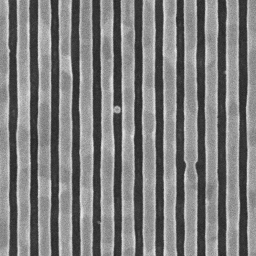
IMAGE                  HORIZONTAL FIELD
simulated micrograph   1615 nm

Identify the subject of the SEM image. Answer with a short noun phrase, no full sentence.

parallel lines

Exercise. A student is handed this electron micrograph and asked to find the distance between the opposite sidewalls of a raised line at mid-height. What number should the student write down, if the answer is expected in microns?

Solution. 0.0804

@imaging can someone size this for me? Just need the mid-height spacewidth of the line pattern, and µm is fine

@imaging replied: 0.0552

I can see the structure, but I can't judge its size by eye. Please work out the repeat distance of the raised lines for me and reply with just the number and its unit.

0.132 microns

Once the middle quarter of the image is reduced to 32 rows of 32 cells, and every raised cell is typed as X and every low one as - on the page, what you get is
XX--XXX--XXX--XXX---XXX--XXX--XX
XX--XXX--XXX--XXX---XXX--XXX--XX
XX--XXX--XXX---XX---XXX--XXX--XX
XX--XXX--XXX--XXX---XXX--XXX--XX
XX--XXX--XXX--XXX---XXX--XXX--XX
XX--XXX--XXX--XXX---XXX--XXX--XX
XX--XXX--XXX--XXX---XXX--XXX--XX
XX--XXX---XX---XXX--XXX--XXX--XX
XX--XXX---XX---XXX--XXX--XXX--XX
XX--XXX---XX---XX---XXX--XXX--XX
XX--XXX---XX---XX---XXX--XXX--XX
XX--XXX---XX---XX---XXX--XXX--XX
XX--XXX--XXX---XX---XXX--XXX--XX
XX--XXX---XX---XX---XXX--XXX--XX
XX--XXX--XXX---XX---XXX--XXX--XX
XX--XXX--XXX---XX---XXX--XXX--XX
XX--XXX---XX---XX---XXX--XXX--XX
XX--XXX---XX---XX---XXX--XXX--XX
XX--XXX---XX---XX---XXX--XXX--XX
XX--XXX--XXX---XX---XXX--XXX--XX
XX--XXX--XXXX--XX---XXX--XXX--XX
XX--XXX--XXXX--XX---XXX--XXX--XX
XX--XXX--XXXX--XX---XXX--XXX--XX
XX--XXX--XXXX--XX---XXX--XXX--XX
XX--XXX--XXXX--XX---XXX--XXX--XX
XX--XXX--XXX---XX---XXX--XXX---X
XX--XXX--XXX---XX---XXX--XXX--XX
XX--XXX--XXX---XX---XXX--XXX--XX
XX--XXX--XXX---XX---XXX--XXX--XX
XX--XXX--XXX---XX---XXX--XXX--XX
XX--XXX--XXX---XX---XXX--XXX--XX
XX--XXX--XXX---XX---XXX--XXX--XX